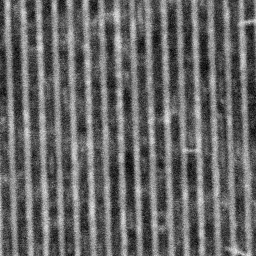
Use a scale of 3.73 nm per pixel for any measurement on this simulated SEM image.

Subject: parallel lines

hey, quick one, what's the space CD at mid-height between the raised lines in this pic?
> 41.9 nanometres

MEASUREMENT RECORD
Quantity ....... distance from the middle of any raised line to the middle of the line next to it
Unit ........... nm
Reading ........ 58.1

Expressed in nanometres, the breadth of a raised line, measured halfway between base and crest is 17.7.